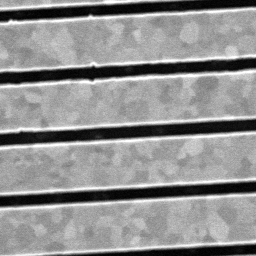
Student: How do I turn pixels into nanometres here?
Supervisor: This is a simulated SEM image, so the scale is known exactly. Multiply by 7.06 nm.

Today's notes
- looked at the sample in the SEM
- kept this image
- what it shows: one or a few lines or trenches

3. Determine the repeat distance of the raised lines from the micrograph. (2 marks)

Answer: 436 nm